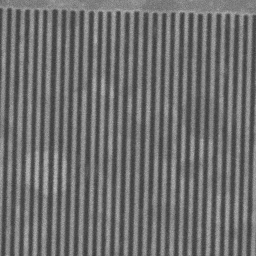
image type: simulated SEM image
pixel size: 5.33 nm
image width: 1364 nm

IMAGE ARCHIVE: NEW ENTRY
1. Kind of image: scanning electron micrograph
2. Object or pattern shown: parallel lines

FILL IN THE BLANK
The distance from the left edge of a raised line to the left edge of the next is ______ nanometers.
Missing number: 48.5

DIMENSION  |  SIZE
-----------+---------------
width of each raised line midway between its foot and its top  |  16.6 nm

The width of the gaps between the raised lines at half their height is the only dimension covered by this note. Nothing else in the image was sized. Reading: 33.3 nanometers